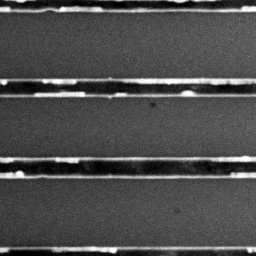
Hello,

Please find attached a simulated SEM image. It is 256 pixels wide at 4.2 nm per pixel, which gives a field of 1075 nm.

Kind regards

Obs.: one or a few lines or trenches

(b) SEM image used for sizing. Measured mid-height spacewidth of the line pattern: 0.285 um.